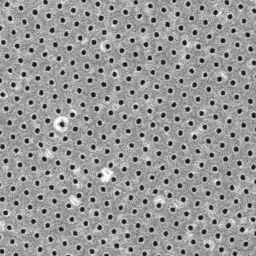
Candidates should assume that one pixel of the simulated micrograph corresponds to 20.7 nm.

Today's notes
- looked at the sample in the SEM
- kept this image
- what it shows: a regular array of holes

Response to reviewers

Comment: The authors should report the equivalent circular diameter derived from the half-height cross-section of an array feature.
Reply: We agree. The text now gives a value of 112 nanometers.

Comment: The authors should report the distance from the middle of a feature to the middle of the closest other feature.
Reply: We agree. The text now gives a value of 14.1 pixels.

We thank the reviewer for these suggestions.